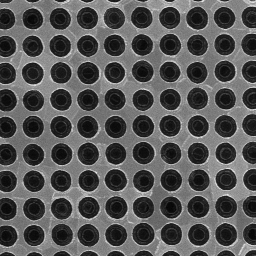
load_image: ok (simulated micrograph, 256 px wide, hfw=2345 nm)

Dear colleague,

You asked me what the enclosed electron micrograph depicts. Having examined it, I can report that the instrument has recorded a regular array of ring-shaped grooves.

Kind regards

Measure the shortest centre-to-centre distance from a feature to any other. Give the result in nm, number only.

245